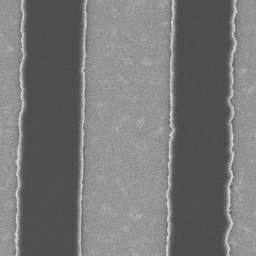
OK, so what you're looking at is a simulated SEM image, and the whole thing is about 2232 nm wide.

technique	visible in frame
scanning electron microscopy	one or a few lines or trenches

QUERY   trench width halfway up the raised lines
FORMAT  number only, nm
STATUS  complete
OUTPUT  751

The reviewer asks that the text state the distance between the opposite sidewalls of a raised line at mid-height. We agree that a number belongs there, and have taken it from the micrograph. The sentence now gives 556 nm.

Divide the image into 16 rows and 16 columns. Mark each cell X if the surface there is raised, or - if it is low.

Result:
-XXXX------XXXX-
-XXXX------XXXX-
-XXXX------XXXX-
-XXXX------XXXX-
-XXXX------XXXX-
-XXXX------XXXX-
-XXXX------XXX--
-XXXX------XXXX-
-XXXX------XXXX-
-XXXX------XXXX-
-XXXX------XXX--
-XXXX-----XXXX--
-XXXX-----XXXX--
-XXXX------XXX--
-XXXX-----XXXX--
-XXXX-----XXXX--